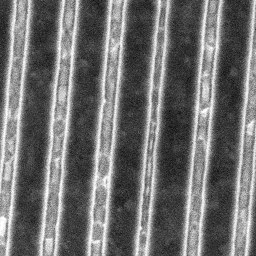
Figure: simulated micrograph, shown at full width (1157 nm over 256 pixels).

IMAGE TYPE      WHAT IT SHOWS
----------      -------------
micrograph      parallel lines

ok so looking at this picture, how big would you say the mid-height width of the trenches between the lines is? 0.0523 um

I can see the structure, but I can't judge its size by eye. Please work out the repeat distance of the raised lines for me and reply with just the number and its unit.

215 nanometers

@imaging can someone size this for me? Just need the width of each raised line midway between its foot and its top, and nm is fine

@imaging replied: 162